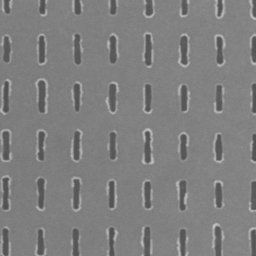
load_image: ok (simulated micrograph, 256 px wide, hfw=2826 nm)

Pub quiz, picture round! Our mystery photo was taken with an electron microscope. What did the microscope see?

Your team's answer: a regular array of holes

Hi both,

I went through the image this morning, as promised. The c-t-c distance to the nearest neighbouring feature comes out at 35.1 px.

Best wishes